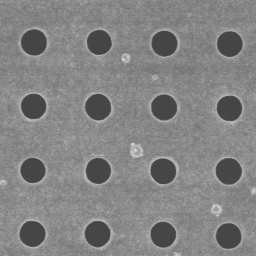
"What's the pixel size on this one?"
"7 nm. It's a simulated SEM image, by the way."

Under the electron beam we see a regular array of holes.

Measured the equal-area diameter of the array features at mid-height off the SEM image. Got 179 nm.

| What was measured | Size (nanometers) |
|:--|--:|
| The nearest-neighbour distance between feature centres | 445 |